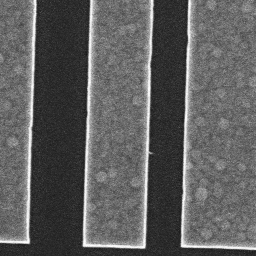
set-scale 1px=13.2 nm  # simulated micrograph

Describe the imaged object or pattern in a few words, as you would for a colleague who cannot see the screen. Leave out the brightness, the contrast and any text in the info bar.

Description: one or a few lines or trenches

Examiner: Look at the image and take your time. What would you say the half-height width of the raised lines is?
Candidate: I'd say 808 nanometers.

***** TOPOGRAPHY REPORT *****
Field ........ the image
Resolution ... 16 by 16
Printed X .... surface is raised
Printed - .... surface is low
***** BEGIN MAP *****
XX----XXXX--XXXX
XX----XXX---XXXX
XX----XXX---XXXX
XX----XXX---XXXX
XX----XXX---XXXX
XX----XXX---XXXX
XX----XXX---XXXX
XX---XXXX---XXXX
XX---XXXX---XXXX
XX---XXXX---XXXX
XX---XXXX--XXXXX
XX---XXXX--XXXXX
XX---XXXX--XXXXX
XX---XXXX--XXXXX
XX---XXXX--XXXXX
---------------X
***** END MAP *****